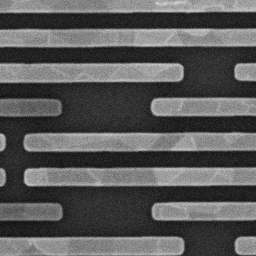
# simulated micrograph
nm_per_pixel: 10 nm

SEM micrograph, wiring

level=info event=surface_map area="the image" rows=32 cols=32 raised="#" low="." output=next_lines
################################
#################......#........
................................
................................
################################
################################
................................
................................
#######################......###
#######################......###
................................
................................
#######............#############
########...........#############
................................
................................
................................
#..#############################
...#############################
................................
................................
...#############################
#..#############################
................................
................................
#######............#############
########...........#############
................................
................................
................................
#######################......###
#######################.......##